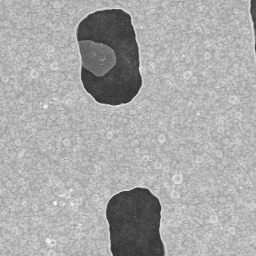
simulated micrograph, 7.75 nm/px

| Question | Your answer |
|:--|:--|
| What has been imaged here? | holes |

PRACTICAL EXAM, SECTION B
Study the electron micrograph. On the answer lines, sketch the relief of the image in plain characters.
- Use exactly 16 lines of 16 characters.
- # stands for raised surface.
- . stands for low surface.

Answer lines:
################
#####...########
#####....#######
#####....#######
#####....#######
#####....#######
#######.########
################
################
################
################
################
#######...######
#######...######
#######...######
#######...######